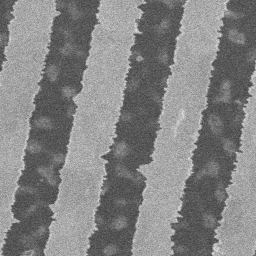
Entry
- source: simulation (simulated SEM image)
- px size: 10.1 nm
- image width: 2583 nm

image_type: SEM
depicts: one or a few lines or trenches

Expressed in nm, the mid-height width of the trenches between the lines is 428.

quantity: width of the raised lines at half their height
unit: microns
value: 0.399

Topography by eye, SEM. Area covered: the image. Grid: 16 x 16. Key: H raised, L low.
LHHLLLHHHLLLHHLL
LHHLLLHHHLLHHHLL
LHHLLLHHLLLHHHLL
HHHLLLHHLLLHHLLL
HHHLLHHHLLLHHLLL
HHLLLHHHLLHHHLLL
HHLLLHHHLLHHHLLH
HHLLLHHLLLHHHLLH
HHLLHHHLLLHHLLLH
HHLLHHHLLLHHLLLH
HLLLHHHLLHHHLLLH
HLLLHHLLLHHHLLHH
HLLHHHLLLHHLLLHH
HLLHHHLLLHHLLLHH
LLLHHHLLHHHLLLHH
LLLHHLLLHHHLLHHH